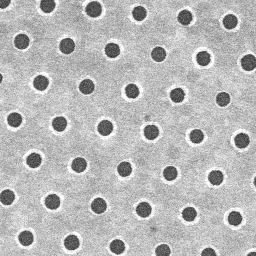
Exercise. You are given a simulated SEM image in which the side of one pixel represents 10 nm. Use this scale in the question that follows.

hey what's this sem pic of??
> a regular array of holes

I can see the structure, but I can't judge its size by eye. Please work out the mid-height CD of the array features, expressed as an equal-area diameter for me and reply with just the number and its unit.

164 nm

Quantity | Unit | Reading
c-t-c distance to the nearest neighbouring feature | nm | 450